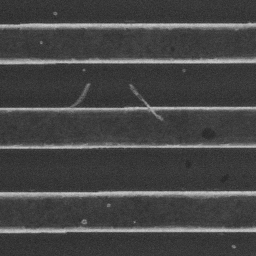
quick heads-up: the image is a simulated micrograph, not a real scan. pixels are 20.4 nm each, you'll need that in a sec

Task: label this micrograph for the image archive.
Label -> lines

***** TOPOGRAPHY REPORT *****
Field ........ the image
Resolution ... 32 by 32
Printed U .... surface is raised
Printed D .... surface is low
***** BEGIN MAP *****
DDDDDDDDDDDDDDDDDDDDDDDDDDDDDDDD
DDDDDDDDDDDDDDDDDDDDDDDDDDDDDDDD
DDDDDDDDDDDDDDDDDDDDDDDDDDDDDDDD
UUUUUUUUUUUUUUUUUUUUUUUUUUUUUUUU
UUUUUUUUUUUUUUUUUUUUUUUUUUUUUUUU
UUUUUUUUUUUUUUUUUUUUUUUUUUUUUUUU
UUUUUUUUUUUUUUUUUUUUUUUUUUUUUUUU
UUUUUUUUUUUUUUUUUUUUUUUUUUUUUUUU
DDDDDDDDDDDDDDDDDDDDDDDDDDDDDDDD
DDDDDDDDDDDDDDDDDDDDDDDDDDDDDDDD
DDDDDDDDDDDDDDDDDDDDDDDDDDDDDDDD
DDDDDDDDDDDDDDDDDDDDDDDDDDDDDDDD
DDDDDDDDDDDDDDDDDDDDDDDDDDDDDDDD
DDDDDDDDDDDDDDDDDDUDUUUUUUUUUUUU
UUUUUUUUUUUUUUUUUUUUUUUUUUUUUUUU
UUUUUUUUUUUUUUUUUUUUUUUUUUUUUUUU
UUUUUUUUUUUUUUUUUUUUUUUUUUUUUUUU
UUUUUUUUUUUUUUUUUUUUUUUUUUUUUUUU
DDDDDDDDDDDDDDDDDDDDDDDDDDDDDDDD
DDDDDDDDDDDDDDDDDDDDDDDDDDDDDDDD
DDDDDDDDDDDDDDDDDDDDDDDDDDDDDDDD
DDDDDDDDDDDDDDDDDDDDDDDDDDDDDDDD
DDDDDDDDDDDDDDDDDDDDDDDDDDDDDDDD
DDDDDDDDDDDDDDDDDDDDDDDDDDDDDDDD
UUUUUUUUUUUUUUUUUUUUUUUUUUUUUUUU
UUUUUUUUUUUUUUUUUUUUUUUUUUUUUUUU
UUUUUUUUUUUUUUUUUUUUUUUUUUUUUUUU
UUUUUUUUUUUUUUUUUUUUUUUUUUUUUUUU
UUUUUUUUUUUUUUUUUUUUUUUUUUUUUUUU
DDDDDDDDDDDDDDDDDDDDDDDDDDDDDDDD
DDDDDDDDDDDDDDDDDDDDDDDDDDDDDDDD
DDDDDDDDDDDDDDDDDDDDDDDDDDDDDDDD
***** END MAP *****